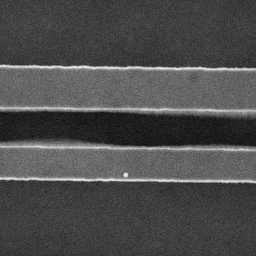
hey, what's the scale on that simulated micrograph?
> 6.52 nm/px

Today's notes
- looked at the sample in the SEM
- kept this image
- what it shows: lines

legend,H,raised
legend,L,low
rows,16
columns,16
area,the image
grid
LLLLLLLLLLLLLLLL
LLLLLLLLLLLLLLLL
LLLLLLLLLLLLLLLL
LLLLLLLLLLLLLLLL
HHHHHHHHHHHHHHHH
HHHHHHHHHHHHHHHH
HHHHHHHHHHHHHHHH
LLLLLLLLLLLLLLLL
LLLLLLLLLLLLLLLL
HHHHHHHHHHHHHHHH
HHHHHHHHHHHHHHHH
LLLLLLLLLLLLLLLL
LLLLLLLLLLLLLLLL
LLLLLLLLLLLLLLLL
LLLLLLLLLLLLLLLL
LLLLLLLLLLLLLLLL